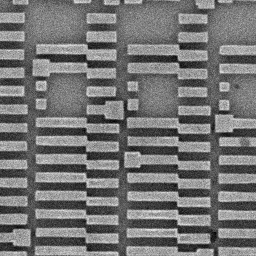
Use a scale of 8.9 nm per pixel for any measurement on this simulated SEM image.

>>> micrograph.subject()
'wiring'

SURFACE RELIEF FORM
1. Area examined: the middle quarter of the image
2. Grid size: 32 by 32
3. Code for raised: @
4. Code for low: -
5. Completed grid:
@@@@@@----------@@@@@@@@@@@@@---
@@@@@@@@@@@@@---@@@@@@@@@@@@@@@@
------@@@@@@@---------------@@@@
-----------------------------@@@
--------------------------------
----------------@@--------------
------@@@@@@@---@@-----------@@@
------@@@@@@@----------------@@@
--------------------------------
-----------@@@@-@@--------------
------@@@@@@@@@-@@--------------
------@@@@@@@@@--------------@@@
------@@@@@@@@@--------------@@@
-----------@@@@-----------------
@@@@@-----------@@@@@@@@@@@@@---
@@@@@@@@@@@@@@--@@@@@@@@@@@@@@@@
------@@@@@@@@--------------@@@@
--------------------------------
@@@@@@----------@@@@@@@@@@@@----
@@@@@@----------@@@@@@@@@@@@@---
-----@@@@@@@@---------------@@@@
------@@@@@@@----------------@@@
---------------@@@@-------------
@@@@@----------@@@@@@@@@@@@@----
@@@@@@@@@@@@@@-@@@@@@@@@@@@@@@@@
------@@@@@@@@-@@@@----------@@@
--------------------------------
@@@@@-----------@@@-------------
@@@@@@----------@@@@@@@@@@@@@---
-----@@@@@@@@---@@@@@@@@@@@@@@@@
------@@@@@@@----------------@@@
--------------------------------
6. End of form